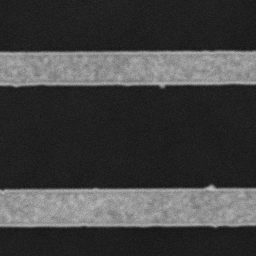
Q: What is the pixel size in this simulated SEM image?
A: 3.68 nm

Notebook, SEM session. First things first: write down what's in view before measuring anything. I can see one or a few lines or trenches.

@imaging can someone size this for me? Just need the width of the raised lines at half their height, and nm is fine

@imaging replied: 122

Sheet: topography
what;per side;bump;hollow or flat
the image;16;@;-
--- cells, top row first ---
----------------
----------------
----------------
@@@@@@@@@@@@@@@@
@@@@@@@@@@@@@@@@
----------------
----------------
----------------
----------------
----------------
----------------
----------------
@@@@@@@@@@@@@@@@
@@@@@@@@@@@@@@@@
----------------
----------------